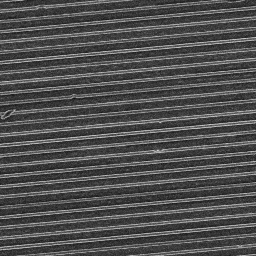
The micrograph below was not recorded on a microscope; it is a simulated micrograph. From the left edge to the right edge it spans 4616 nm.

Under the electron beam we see parallel lines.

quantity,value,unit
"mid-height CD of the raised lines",51.6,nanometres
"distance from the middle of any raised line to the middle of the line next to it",185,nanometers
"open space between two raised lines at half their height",7.59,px